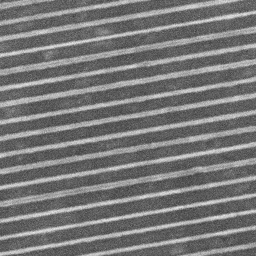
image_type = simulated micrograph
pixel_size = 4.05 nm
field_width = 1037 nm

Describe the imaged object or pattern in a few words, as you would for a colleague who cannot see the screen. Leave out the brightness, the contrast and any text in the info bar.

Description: parallel lines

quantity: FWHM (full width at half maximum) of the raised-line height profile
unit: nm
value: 13.9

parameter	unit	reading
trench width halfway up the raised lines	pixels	12.8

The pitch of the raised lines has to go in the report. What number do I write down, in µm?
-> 0.0661